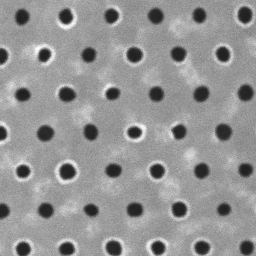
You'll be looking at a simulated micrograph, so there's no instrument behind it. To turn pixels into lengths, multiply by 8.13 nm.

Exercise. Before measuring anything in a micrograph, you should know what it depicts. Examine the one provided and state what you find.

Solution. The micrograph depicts a regular array of holes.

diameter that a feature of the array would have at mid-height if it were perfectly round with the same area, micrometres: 0.13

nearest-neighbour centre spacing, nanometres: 357